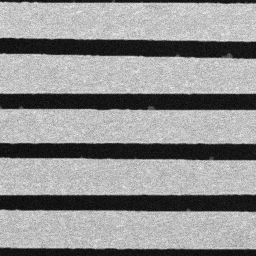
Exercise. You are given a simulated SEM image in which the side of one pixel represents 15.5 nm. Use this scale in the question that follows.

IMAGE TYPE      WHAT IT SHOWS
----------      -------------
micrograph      lines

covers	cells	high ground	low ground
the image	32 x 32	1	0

11111111111111111111111111111111
11111111111111111111111111111111
11111111111111111111111111111111
11111111111111111111111111111111
11111111111111111111111111111111
00000000000000000000000000000000
00000000000000000000000000000000
11111111111111111111111111111111
11111111111111111111111111111111
11111111111111111111111111111111
11111111111111111111111111111111
11111111111111111111111111111111
00000000000000000000000000000000
00000000000000000000000000000000
11111111111111111111111111111111
11111111111111111111111111111111
11111111111111111111111111111111
11111111111111111111111111111111
00000000000000000000000000000000
00000000000000000000000000000000
11111111111111111111111111111111
11111111111111111111111111111111
11111111111111111111111111111111
11111111111111111111111111111111
00000000000000000000000000000000
00000000000000000000000000000000
11111111111111111100000000000000
11111111111111111111111111111111
11111111111111111111111111111111
11111111111111111111111111111111
11111111111111111111111111111111
00000000000000000000000000000000